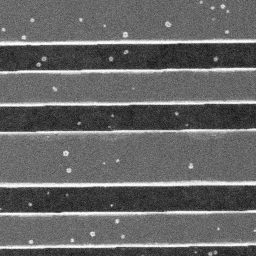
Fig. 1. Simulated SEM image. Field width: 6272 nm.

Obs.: lines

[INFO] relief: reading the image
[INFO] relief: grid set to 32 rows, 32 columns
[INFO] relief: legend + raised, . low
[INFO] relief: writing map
++++++++++++++++++++++++++++++++
++++++++++++++++++++++++++++++++
++++++++++++++++++++++++++++++++
++++++++++++++++++++++++++++++++
++++++++++++++++++++++++++++++++
................................
................................
................................
................................
++++++++++++++++++++++++++++++++
++++++++++++++++++++++++++++++++
++++++++++++++++++++++++++++++++
++++++++++++++++++++++++++++++++
................................
................................
................................
.......+++++++++++++++++++++++++
++++++++++++++++++++++++++++++++
++++++++++++++++++++++++++++++++
++++++++++++++++++++++++++++++++
++++++++++++++++++++++++++++++++
++++++++++++++++++++++++++++++++
++++++++++++++++++++++++++++++++
................................
................................
................................
.........................+++++++
++++++++++++++++++++++++++++++++
++++++++++++++++++++++++++++++++
++++++++++++++++++++++++++++++++
++++++++++++++++++++++++++++++++
................................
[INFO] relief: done